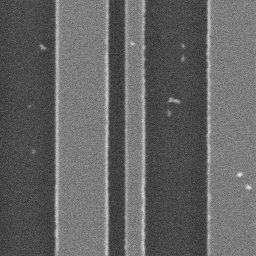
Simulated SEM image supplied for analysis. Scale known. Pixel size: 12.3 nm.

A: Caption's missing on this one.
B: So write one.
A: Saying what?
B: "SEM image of lines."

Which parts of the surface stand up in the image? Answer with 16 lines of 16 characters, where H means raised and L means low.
LLLLHHHHHLLLLHHH
LLLLHHHHHLLLLHHH
LLLLHHHHHLLLLHHH
LLLLHHHHHLLLLHHH
LLLLHHHHHLLLLHHH
LLLLHHHHHLLLLHHH
LLLLHHHHHLLLLHHH
LLLLHHHHHLLLLHHH
LLLLHHHHHLLLLHHH
LLLLHHHHHLLLLHHH
LLLLHHHHHLLLLHHH
LLLLHHHHHLLLLHHH
LLLLHHHHHLLLLHHH
LLLLHHHHHLLLLHHH
LLLLHHHHHLLLLHHH
LLLLHHHHHLLLLHHH